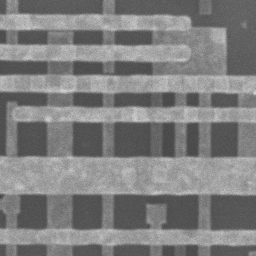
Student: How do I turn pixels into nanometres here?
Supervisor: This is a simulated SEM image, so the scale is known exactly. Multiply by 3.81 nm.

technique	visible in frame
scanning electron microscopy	wiring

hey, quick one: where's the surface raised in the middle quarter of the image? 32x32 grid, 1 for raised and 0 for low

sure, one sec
00000000000000000000000000000000
00000000000000000000000000000000
00000000000000000000000000000000
11111111111111111111111111111111
11111111111111111111111111111111
11111111111111111111111111111111
11111111111111111111111111111111
00000000000000000000000000000000
00000000000000000000000000000000
00000000000000000000000000000000
00000000000000000000000000000000
11111111111111111111111111111111
11111111111111111111111111111111
11111111111111111111111111111111
00000000000000000000000000001111
00000000000000000000000000000000
00000000000000000000000000000000
00000000000000000000000000000000
00000000000000000000000000000000
00000000000000000000000000000000
00000000000000000000000000000000
00000000000000000000000000000000
00000000000000000000000000000000
11111111000010000111110000000111
11111111111111111111111111111111
11111111111111111111111111111111
11111111111111111111111111111111
11111111111111111111111111111111
11111111111111111111111111111111
11111111111111111111111111111111
11111111111111111111111111111111
11111111111111111111111111111111